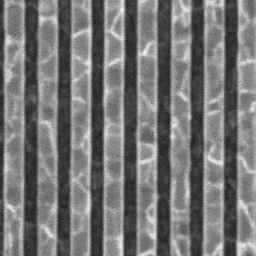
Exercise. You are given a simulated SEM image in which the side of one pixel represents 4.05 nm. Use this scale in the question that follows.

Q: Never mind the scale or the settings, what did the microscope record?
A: parallel lines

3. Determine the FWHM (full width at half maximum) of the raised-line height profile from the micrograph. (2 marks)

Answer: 72.9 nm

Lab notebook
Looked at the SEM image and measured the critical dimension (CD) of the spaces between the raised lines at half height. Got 0.0613 micrometres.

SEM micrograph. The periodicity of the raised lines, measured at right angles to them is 135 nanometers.